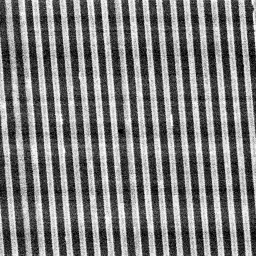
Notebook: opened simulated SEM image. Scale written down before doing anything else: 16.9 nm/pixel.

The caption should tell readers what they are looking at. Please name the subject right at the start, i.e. parallel lines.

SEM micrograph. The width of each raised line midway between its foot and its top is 4.36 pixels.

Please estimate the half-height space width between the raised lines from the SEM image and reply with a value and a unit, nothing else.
158 nanometres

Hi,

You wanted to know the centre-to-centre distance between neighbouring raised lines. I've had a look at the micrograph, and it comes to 232 nanometres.